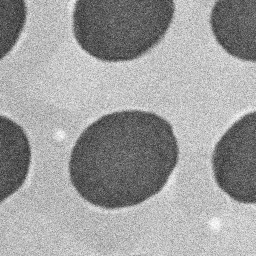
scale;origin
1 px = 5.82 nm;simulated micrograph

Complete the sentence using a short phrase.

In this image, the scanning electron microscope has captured holes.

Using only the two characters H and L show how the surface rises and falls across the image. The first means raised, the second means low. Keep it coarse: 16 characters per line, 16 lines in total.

LLHHHLLLLLLHHLLL
LHHHHLLLLLLHHLLL
LHHHHLLLLLHHHHLL
HHHHHHLLLHHHHHLL
HHHHHHHHHHHHHHHH
HHHHHHHHHHHHHHHH
HHHHHHHHHHHHHHHH
LHHHHHLLLLHHHHHL
LLHHHLLLLLLHHHLL
LLHHHLLLLLLHHLLL
LLHHLLLLLLLHHLLL
LHHHHLLLLLHHHHLL
HHHHHLLLLHHHHHHL
HHHHHHHHHHHHHHHH
HHHHHHHHHHHHHHHH
HHHHHHHHHHHHHHHH